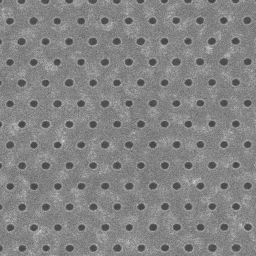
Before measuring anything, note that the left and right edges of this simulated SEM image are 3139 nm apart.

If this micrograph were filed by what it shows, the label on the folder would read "a regular array of holes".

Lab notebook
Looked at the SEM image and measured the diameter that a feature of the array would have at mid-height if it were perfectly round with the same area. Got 0.0948 µm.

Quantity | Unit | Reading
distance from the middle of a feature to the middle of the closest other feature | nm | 288